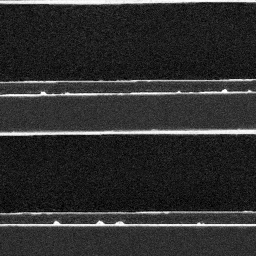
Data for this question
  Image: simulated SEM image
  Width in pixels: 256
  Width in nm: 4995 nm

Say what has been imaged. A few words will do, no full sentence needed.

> lines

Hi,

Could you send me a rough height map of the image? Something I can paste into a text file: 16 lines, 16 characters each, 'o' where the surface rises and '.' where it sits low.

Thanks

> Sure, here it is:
................
................
................
................
................
oooooooooooooooo
oooooooooooooooo
oooooooooooooooo
................
................
................
................
................
oooooooooooooooo
oooooooooooooooo
oooooooooooooooo